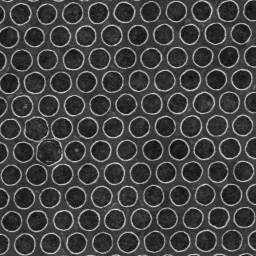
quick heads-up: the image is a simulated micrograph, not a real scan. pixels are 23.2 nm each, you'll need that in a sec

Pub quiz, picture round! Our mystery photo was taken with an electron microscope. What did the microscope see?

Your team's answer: a regular array of holes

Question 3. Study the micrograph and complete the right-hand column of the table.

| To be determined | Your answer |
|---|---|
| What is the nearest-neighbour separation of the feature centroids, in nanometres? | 596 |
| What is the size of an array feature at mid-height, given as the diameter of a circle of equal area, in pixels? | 20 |